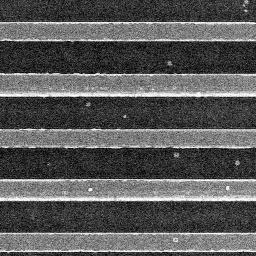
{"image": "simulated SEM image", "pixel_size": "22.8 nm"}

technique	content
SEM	lines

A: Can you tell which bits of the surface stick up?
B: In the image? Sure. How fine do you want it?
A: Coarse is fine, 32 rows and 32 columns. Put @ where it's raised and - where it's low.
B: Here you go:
--------------------------------
--------------------------------
--------------------------------
@@@@@@@@@@@@@@@@@@@@@@@@@@@@@@@@
@@@@@@@@@@@@@@@@@@@@@@@@@@@@@@@@
--------------------------------
--------------------------------
--------------------------------
--------------------------------
@@@@@@@@@@@@@@@@@@@@@@@@@@@@@@@@
@@@@@@@@@@@@@@@@@@@@@@@@@@@@@@@@
@@@@@@@@@@@@@@@@@@@@@@@@@@@@@@@@
--------------------------------
--------------------------------
--------------------------------
--------------------------------
@@@@@@@@@@@@@@@@@@@@@@@@@@@@@@@@
@@@@@@@@@@@@@@@@@@@@@@@@@@@@@@@@
--------------------------------
--------------------------------
--------------------------------
--------------------------------
--------------------------------
@@@@@@@@@@@@@@@@@@@@@@@@@@@@@@@@
@@@@@@@@@@@@@@@@@@@@@@@@@@@@@@@@
--------------------------------
--------------------------------
--------------------------------
--------------------------------
@@@@@@@@@@@@@@@@@@@@@@@@@@@@@@@@
@@@@@@@@@@@@@@@@@@@@@@@@@@@@@@@@
@@-----------------@------------